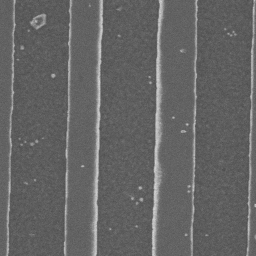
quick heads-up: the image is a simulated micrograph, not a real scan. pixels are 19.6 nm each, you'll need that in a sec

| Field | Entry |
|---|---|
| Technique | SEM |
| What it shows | lines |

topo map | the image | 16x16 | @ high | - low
@---@@----@@----
@---@@----@@----
@---@@----@@----
@---@@----@@----
@---@@----@@----
@---@@----@@----
@---@@----@@----
@---@@----@@----
@---@@----@@----
@---@@----@@----
@---@@----@@----
@---@@----@@----
@---@@----@@----
@---@@----@@----
@---@@----@@----
@---@@----@@---@